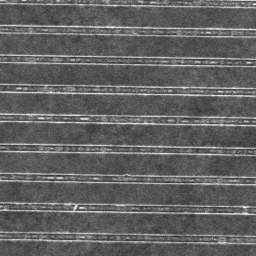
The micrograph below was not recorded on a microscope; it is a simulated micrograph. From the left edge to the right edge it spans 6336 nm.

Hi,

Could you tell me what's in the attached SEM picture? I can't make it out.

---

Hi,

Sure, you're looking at parallel lines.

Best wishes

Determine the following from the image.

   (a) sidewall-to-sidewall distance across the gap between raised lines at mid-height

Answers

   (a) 0.158 um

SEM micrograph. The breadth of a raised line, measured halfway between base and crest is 0.569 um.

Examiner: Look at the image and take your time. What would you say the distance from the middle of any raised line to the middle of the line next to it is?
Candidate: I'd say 731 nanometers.